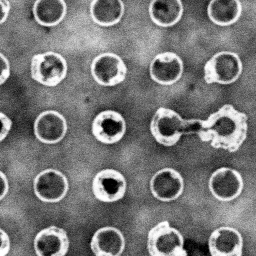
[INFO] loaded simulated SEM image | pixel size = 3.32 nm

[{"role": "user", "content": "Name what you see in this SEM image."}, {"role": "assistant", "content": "a regular array of raised bodies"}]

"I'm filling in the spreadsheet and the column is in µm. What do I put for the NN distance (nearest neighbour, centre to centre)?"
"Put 0.191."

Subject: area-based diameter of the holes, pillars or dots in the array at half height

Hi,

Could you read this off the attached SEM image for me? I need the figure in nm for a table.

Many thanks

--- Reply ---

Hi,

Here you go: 106